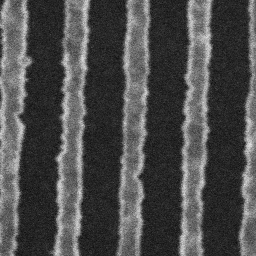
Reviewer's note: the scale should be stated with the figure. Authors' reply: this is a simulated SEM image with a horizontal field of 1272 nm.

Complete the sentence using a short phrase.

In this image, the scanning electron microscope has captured one or a few lines or trenches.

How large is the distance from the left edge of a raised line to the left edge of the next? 305 nanometres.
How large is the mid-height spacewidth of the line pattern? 206 nanometers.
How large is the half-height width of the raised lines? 0.1 microns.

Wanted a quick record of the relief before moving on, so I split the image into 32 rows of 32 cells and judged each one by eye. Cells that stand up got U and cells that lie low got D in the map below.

DUUDDDDDUUUDDDDDUUDDDDDDUUDDDDDU
UUUDDDDDUUUDDDDDUUDDDDDDUUDDDDDU
UUUDDDDDUUUDDDDDUUUDDDDDUUDDDDDU
UUUDDDDDUUUDDDDDUUDDDDDDUUDDDDDU
UUUDDDDDUUUDDDDDUUDDDDDDUUDDDDDU
UUUDDDDDUUUDDDDDUUDDDDDDUUDDDDDU
UUUDDDDDUUUDDDDDUUDDDDDDUUDDDDDU
UUUUDDDDUUUDDDDDUUDDDDDDUUDDDDDU
UUUDDDDDUUUDDDDDUUDDDDDDUUDDDDDU
UUUDDDDDUUDDDDDDUUDDDDDUUUDDDDDD
UUUDDDDDUUDDDDDDUUDDDDDDUUDDDDDU
UUUDDDDDUUDDDDDDUUDDDDDUUUDDDDDU
UUUDDDDDUUDDDDDDUUDDDDDUUUDDDDDU
UUUDDDDDUUDDDDDDUUDDDDDUUUDDDDDU
UUDDDDDDUUDDDDDDUUDDDDDUUUDDDDDU
UUUDDDDDUUDDDDDDUUDDDDDUUUDDDDDU
UUUDDDDDUUDDDDDDUUDDDDDUUUDDDDDU
UUUDDDDDUUDDDDDDUUDDDDDUUUDDDDDU
UUDDDDDDUUDDDDDDUUDDDDDUUUDDDDDU
UUDDDDDUUUDDDDDUUUDDDDDUUUDDDDDU
UUDDDDDUUUDDDDDUUUDDDDDUUUDDDDDU
UUDDDDDUUUDDDDDUUDDDDDDUUDDDDDDU
UUDDDDDUUUDDDDDUUDDDDDDUUDDDDDDU
UUDDDDDUUUDDDDDUUUDDDDDUUDDDDDUU
UUDDDDDUUUDDDDDUUUDDDDDUUDDDDDDU
UUDDDDDUUUDDDDDUUDDDDDDUUDDDDDDU
UUDDDDDDUUDDDDDUUDDDDDDUUDDDDDDU
UUDDDDDUUUDDDDDUUUDDDDDUUDDDDDDU
UUDDDDDUUUDDDDDUUUDDDDDUUDDDDDUU
UUDDDDDUUUDDDDDUUDDDDDDUUDDDDDUU
UUDDDDDUUUDDDDDUUDDDDDDUUDDDDDUU
UUDDDDDUUUDDDDDUUDDDDDDUUDDDDDUU